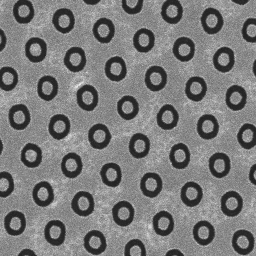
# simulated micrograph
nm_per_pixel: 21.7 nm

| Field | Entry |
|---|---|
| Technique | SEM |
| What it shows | a regular array of ring-shaped grooves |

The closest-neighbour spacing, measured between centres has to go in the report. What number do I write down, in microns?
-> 0.866